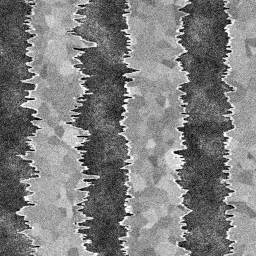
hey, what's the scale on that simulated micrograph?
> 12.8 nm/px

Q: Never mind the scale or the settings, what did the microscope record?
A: one or a few lines or trenches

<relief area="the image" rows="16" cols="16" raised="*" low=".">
..***...****..**
..***...***...**
..***...***...**
..***...***...**
..***...****..**
..***...***...**
..***...***...**
..***...***...**
..***...***...**
..***...***...**
..***...***...**
..***...***...**
..***...***...**
.****...****..**
..***...****..**
..****..***...**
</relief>